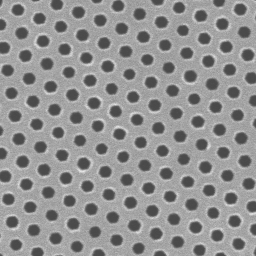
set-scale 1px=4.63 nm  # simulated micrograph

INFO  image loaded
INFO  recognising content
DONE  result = a regular array of holes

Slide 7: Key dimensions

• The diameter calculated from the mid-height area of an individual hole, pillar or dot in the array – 0.0568 micrometres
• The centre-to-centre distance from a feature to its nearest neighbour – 106 nm